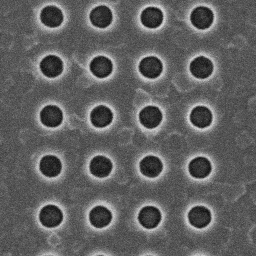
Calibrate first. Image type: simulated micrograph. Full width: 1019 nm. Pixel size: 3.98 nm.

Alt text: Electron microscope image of a regular array of holes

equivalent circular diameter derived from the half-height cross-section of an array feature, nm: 94.9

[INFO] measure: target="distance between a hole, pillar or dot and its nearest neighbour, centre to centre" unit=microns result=0.197